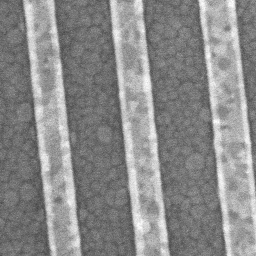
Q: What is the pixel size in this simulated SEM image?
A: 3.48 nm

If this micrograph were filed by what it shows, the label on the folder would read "one or a few lines or trenches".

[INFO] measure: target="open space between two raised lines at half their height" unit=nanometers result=212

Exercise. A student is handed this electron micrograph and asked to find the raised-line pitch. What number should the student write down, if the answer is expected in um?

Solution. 0.307